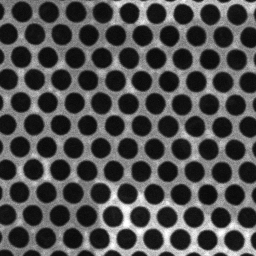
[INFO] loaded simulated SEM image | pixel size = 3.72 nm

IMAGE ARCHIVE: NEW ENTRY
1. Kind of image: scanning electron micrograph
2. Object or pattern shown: a regular array of holes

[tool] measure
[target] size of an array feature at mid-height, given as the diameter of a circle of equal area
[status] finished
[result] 77.5 nm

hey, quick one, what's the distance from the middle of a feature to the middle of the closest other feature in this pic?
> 0.0966 micrometres